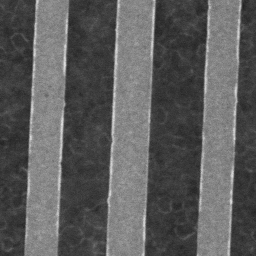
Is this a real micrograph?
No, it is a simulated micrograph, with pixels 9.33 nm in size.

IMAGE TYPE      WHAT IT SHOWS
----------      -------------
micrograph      one or a few lines or trenches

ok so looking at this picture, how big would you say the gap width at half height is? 0.461 um